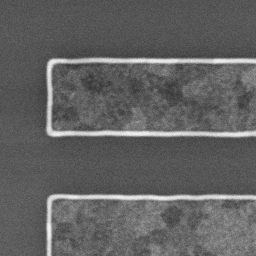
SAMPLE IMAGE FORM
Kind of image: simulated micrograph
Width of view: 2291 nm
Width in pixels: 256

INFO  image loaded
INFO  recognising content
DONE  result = wiring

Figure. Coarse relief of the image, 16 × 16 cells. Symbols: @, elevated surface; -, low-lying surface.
----------------
----------------
----------------
----------------
---@@@@@@@@@@@@@
---@@@@@@@@@@@@@
---@@@@@@@@@@@@@
---@@@@@@@@@@@@@
----------------
----------------
----------------
----------------
---@@@@@@@@@@@@@
---@@@@@@@@@@@@@
---@@@@@@@@@@@@@
---@@@@@@@@@@@@@